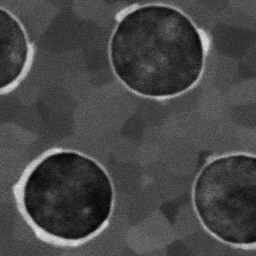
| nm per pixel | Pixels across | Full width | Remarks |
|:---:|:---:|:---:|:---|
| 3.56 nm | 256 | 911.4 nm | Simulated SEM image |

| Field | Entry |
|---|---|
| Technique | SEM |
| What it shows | holes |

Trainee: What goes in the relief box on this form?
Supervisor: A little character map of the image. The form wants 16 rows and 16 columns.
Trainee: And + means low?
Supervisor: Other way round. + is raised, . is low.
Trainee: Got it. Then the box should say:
+++++++++..+++++
.++++++.....++++
..+++++......+++
..+++++......+++
.++++++......+++
++++++++....++++
++++++++++++++++
++++++++++++++++
++++++++++++++++
++++++++++++++++
++....+++++++...
++.....+++++....
+......+++++....
++.....+++++....
+++...+++++++...
++++++++++++++++